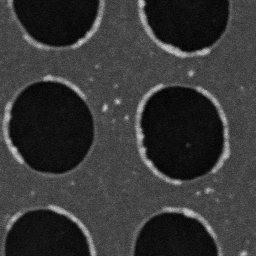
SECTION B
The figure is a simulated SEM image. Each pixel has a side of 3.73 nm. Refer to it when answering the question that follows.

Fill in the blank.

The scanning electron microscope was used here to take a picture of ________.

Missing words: holes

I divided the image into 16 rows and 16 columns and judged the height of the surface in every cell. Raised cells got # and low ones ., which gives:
#.....###.....##
#.....###.....##
##...#####....##
################
################
##..######..####
#....####....###
#.....###.....##
#.....###.....##
#.....###.....##
##...#####...###
################
################
#...######..####
#....####....###
......##......##